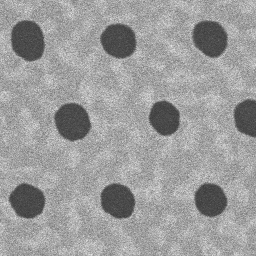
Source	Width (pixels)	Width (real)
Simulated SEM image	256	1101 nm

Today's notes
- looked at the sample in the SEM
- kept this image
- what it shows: a regular array of holes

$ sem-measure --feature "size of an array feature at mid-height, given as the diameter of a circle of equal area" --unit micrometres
0.149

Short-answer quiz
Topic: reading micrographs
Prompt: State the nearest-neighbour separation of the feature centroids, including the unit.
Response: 0.39 micrometres